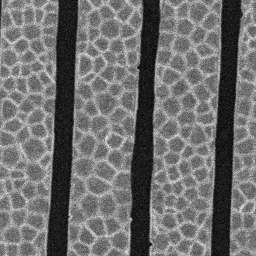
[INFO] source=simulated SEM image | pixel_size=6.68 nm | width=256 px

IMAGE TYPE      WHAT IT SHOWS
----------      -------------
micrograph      one or a few lines or trenches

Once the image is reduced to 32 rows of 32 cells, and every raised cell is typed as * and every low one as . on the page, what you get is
*******...********..********..**
*******...********..********..**
*******...********..********..**
*******...********..********..**
*******...*******...*******...**
*******...********..********..**
*******..*********..********..**
*******..********...*******...**
*******..********...*******...**
*******..********..********...**
*******..********..********...**
*******..********..********...**
*******..********..********...**
*******..********..********..***
*******..********..********..***
*******..********..********..***
*******..********..********..***
*******..********..********..***
*******..********..********..***
******...*******...********..***
******...*******...********..***
******...*******...********..***
******...*******...********..***
******...*******...********..***
******...*******...*******...***
******...*******...*******...***
******...*******...*******...***
******...*******...*******...***
******...*******...*******...***
******...*******...*******...***
******...*******...*******...***
******...*******...*******...***